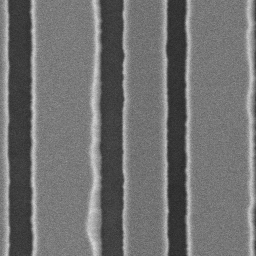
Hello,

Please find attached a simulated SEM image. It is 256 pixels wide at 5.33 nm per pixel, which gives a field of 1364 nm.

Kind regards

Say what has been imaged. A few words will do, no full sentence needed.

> lines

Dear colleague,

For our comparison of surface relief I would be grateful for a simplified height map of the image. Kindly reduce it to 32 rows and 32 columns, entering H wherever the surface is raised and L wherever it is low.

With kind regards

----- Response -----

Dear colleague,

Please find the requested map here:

HLLLHHHHHHHHLLLLHHHHHLLHHHHHHHHH
HLLLHHHHHHHHLLLHHHHHHLLHHHHHHHHH
HLLLHHHHHHHHLLLHHHHHHLLHHHHHHHHH
HLLLHHHHHHHHLLLLHHHHHLLHHHHHHHHH
HLLLHHHHHHHHLLLHHHHHHLLHHHHHHHHH
HLLLHHHHHHHHLLLHHHHHHLLHHHHHHHHH
HLLLHHHHHHHHHLLLHHHHHLLHHHHHHHHH
HLLLHHHHHHHHLLLLHHHHHLLHHHHHHHHH
HLLLHHHHHHHHLLLHHHHHHLLHHHHHHHHH
HLLLHHHHHHHHLLLHHHHHHLLHHHHHHHHH
HLLLHHHHHHHHLLLHHHHHHLLHHHHHHHHH
HLLLHHHHHHHHLLLHHHHHHLLHHHHHHHHH
HLLLHHHHHHHHLLLLHHHHHLLHHHHHHHHH
HLLLHHHHHHHHLLLHHHHHHLLHHHHHHHHH
HLLLHHHHHHHHLLLHHHHHHLLHHHHHHHHH
HLLLHHHHHHHHLLLHHHHHHLLHHHHHHHHH
HLLLHHHHHHHHLLLHHHHHHLLHHHHHHHHH
HLLLHHHHHHHHLLLHHHHHHLLHHHHHHHHH
HLLLHHHHHHHHLLLHHHHHHLLHHHHHHHHH
HLLLHHHHHHHHLLLHHHHHHLLHHHHHHHHH
HLLLHHHHHHHHLLLHHHHHHLLHHHHHHHHH
HLLLHHHHHHHHLLLHHHHHHLLHHHHHHHHH
HLLLHHHHHHHHLLLLHHHHHLLHHHHHHHHH
HLLLHHHHHHHHLLLHHHHHHLLHHHHHHHHH
HLLLHHHHHHHHLLLHHHHHHLLHHHHHHHHH
HLLLHHHHHHHHLLLLHHHHHLLHHHHHHHHH
HLLLHHHHHHHHLLLHHHHHHLLHHHHHHHHH
HLLLHHHHHHHHLLLHHHHHHLLHHHHHHHHH
HLLLHHHHHHHHLLLHHHHHHLLHHHHHHHHH
HLLLHHHHHHHHLLLHHHHHHLLHHHHHHHHH
HLLLHHHHHHHHLLLHHHHHHLLHHHHHHHHH
HLLLHHHHHHHHLLLHHHHHHLLHHHHHHHHH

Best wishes